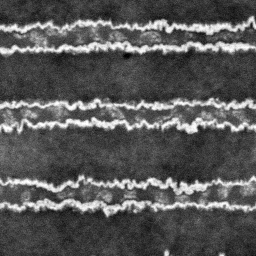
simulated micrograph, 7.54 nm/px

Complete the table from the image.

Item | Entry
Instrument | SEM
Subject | one or a few lines or trenches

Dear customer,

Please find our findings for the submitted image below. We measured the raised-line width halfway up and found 171 nm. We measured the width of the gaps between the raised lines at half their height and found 422 nm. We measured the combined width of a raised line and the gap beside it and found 594 nm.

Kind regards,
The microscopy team